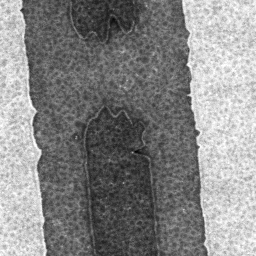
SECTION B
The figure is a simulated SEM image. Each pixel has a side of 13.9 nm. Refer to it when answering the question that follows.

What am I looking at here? one or a few lines or trenches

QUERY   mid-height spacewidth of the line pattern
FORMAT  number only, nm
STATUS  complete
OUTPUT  696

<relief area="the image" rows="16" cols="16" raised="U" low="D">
UDDDUUUUDDDDUUUU
UDDDDUUUDDDDUUUU
UDDDDDDDDDDDUUUU
UUDDDDDDDDDDUUUU
UUDDDDDDDDDDUUUU
UUDDDDDDDDDDUUUU
UUDDDDDDDDDDUUUU
UUDDDDUUDDDDUUUU
UUDDDUUUUDDDUUUU
UUDDDUUUUDDDUUUU
UUDDDUUUUDDDUUUU
UUDDDUUUUDDDDUUU
UUUDDDUUUUDDDUUU
UUUDDDUUUUDDDUUU
UUUDDDUUUUDDDUUU
UUUDDDUUUUDDDUUU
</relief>